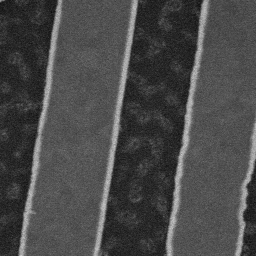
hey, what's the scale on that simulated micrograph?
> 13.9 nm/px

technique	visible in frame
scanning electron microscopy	one or a few lines or trenches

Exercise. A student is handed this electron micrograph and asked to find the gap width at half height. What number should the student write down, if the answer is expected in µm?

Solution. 0.973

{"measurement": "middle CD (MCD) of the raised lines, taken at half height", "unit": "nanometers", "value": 1020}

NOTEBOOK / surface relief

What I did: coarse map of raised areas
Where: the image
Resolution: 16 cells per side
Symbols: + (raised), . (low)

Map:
....++++.....+++
....++++.....+++
...+++++.....+++
...+++++....++++
...+++++....++++
...+++++....++++
...++++.....++++
...++++.....++++
..+++++.....++++
..+++++....+++++
..+++++....+++++
..+++++....++++.
..+++++....++++.
..++++.....++++.
.+++++.....++++.
.+++++.....++++.